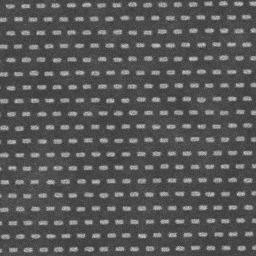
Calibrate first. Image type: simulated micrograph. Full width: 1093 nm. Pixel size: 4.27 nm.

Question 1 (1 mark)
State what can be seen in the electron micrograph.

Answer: a regular array of raised bodies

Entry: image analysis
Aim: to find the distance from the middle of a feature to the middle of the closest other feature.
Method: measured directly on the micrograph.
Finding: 0.0634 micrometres